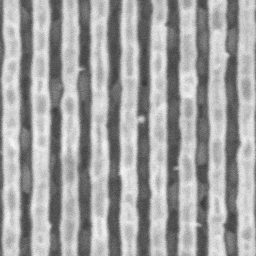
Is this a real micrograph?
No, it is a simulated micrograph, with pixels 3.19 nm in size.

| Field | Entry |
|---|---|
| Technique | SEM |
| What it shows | parallel lines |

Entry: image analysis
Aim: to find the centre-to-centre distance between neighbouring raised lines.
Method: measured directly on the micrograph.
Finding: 93.9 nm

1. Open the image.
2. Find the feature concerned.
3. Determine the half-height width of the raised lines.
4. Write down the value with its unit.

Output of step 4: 45.9 nm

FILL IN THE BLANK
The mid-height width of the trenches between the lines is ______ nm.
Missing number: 46.3